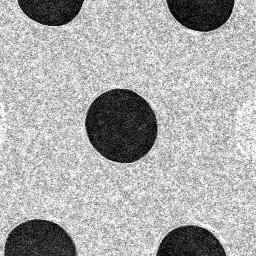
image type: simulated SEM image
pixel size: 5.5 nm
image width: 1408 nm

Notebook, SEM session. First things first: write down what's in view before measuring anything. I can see holes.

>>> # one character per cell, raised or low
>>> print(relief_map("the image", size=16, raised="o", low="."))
o....oooooo....o
ooo.ooooooo...oo
oooooooooooooooo
oooooooooooooooo
oooooooooooooooo
oooooooooooooooo
oooooo...ooooooo
ooooo.....oooooo
ooooo.....oooooo
oooooo...ooooooo
oooooooooooooooo
oooooooooooooooo
oooooooooooooooo
oooooooooooooooo
o...ooooooo..ooo
.....ooooo....oo